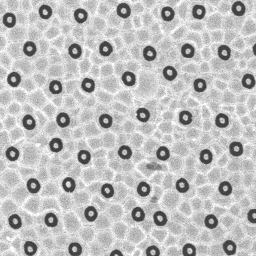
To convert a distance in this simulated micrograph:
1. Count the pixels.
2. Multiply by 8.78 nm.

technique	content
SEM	a regular array of ring-shaped grooves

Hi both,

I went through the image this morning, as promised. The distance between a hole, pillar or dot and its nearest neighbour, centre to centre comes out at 284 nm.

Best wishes